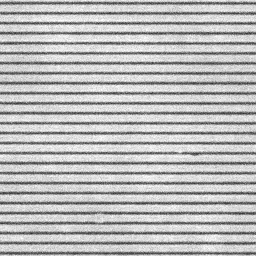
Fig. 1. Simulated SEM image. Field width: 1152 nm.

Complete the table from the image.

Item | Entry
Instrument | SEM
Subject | parallel lines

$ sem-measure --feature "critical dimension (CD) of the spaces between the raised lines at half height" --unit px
3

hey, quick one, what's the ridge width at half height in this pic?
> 31.5 nm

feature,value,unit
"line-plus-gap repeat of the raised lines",0.045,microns